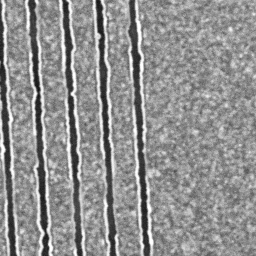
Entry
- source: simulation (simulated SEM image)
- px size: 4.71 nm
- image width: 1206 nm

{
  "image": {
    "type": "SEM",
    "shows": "parallel lines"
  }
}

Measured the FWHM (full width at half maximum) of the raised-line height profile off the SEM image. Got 125 nanometers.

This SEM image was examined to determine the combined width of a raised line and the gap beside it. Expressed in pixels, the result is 33.3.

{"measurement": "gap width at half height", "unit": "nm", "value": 34.7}